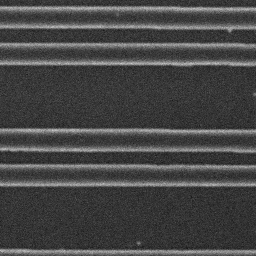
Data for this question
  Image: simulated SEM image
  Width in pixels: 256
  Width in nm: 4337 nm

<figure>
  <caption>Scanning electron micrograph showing lines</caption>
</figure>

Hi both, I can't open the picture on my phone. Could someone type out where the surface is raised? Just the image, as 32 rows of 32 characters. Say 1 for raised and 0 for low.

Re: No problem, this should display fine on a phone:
00000000000000000000000000000000
11111111111111111111111111111111
11111111111111111111111111111111
00000000000000000000000111111111
00000000000000000000000000000000
11111111111111111111111100000000
11111111111111111111111111111111
11111111111111111111111111111111
00000000000000000000000000000000
00000000000000000000000000000000
00000000000000000000000000000000
00000000000000000000000000000000
00000000000000000000000000000000
00000000000000000000000000000000
00000000000000000000000000000000
00000000000000000000000000000000
11111111111111111111111111111111
11111111111111111111111111111111
11111111111111111111111111111111
00000000000000000000000000000000
00000000000000000000000000000000
11111111111111111111111111111111
11111111111111111111111111111111
00000000000000000000000000000000
00000000000000000000000000000000
00000000000000000000000000000000
00000000000000000000000000000000
00000000000000000000000000000000
00000000000000000000000000000000
00000000000000000000000000000000
00000000000000000000000000000000
11111111111111111111111111111111